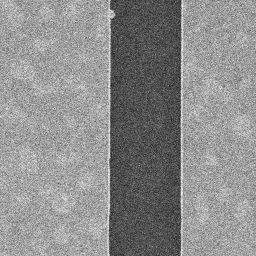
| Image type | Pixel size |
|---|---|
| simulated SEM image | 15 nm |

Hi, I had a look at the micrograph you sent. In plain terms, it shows one or a few lines or trenches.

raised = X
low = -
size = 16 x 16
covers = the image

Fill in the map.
XXXXXXX----XXXXX
XXXXXXX----XXXXX
XXXXXXX----XXXXX
XXXXXXX----XXXXX
XXXXXXX----XXXXX
XXXXXXX----XXXXX
XXXXXXX----XXXXX
XXXXXXX----XXXXX
XXXXXXX----XXXXX
XXXXXXX----XXXXX
XXXXXXX----XXXXX
XXXXXXX----XXXXX
XXXXXXX----XXXXX
XXXXXXX----XXXXX
XXXXXXX----XXXXX
XXXXXXX----XXXXX